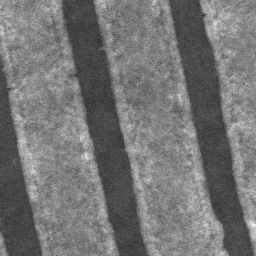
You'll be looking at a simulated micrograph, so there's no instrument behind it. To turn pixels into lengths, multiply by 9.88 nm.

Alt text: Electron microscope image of one or a few lines or trenches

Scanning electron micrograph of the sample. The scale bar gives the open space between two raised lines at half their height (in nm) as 400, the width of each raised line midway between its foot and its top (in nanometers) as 629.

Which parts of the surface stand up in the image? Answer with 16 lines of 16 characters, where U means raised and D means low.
UUUUDDUUUUDDDUUU
UUUUDDUUUUUDDUUU
UUUUDDDUUUUDDUUU
UUUUDDDUUUUDDDUU
DUUUDDDUUUUDDDUU
DUUUUDDUUUUDDDUU
DUUUUDDDUUUUDDUU
DUUUUDDDUUUUDDUU
DUUUUDDDUUUUDDDU
DDUUUUDDUUUUDDDU
DDUUUUDDUUUUDDDU
DDUUUUDDDUUUUDDU
DDUUUUDDDUUUUDDU
DDUUUUDDDUUUUDDD
DDDUUUUDDUUUUUDD
DDDUUUUDDUUUUUDD